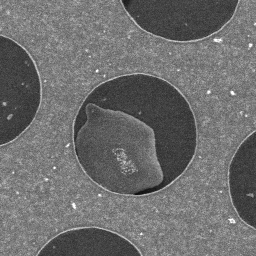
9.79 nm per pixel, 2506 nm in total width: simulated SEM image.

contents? holes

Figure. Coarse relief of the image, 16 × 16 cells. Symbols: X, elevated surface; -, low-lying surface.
XXXXXXXX-------X
XXXXXXXXX-----XX
-XXXXXXXXXX-XXXX
--XXXXXXXXXXXXXX
--XXXXXXXXXXXXXX
---XXX-----XXXXX
--XXX-------XXXX
--XXX-------XXXX
-XXXX-------XXXX
XXXXX-------XXX-
XXXXX-------XX--
XXXXXX-----XXX--
XXXXXXXXXXXXXX--
XXXXXXXXXXXXXXX-
XXXX---XXXXXXXXX
XXX-----XXXXXXXX